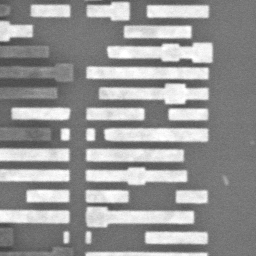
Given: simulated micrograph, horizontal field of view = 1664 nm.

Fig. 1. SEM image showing wiring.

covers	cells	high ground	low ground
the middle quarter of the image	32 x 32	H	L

HHLLLLLLLLLLLLLLLLLLLLLLLLLLLLLL
HHLLLLHHHHHHHHHHHHHHHHHHHHHHHHHH
HHLLLLHHHHHHHHHHHHHHHHHHHHHHHHHH
HHLLLLLLLLLLLLLLLLLLLLLLLLLLHHHH
LLLLLLLLLLLLLLLLLLLLLLLLLLLLLLLL
LLLLLLLLLLLLLLLLLLLLLLLLLHHHHHLL
LLLLLLLLLHHHHHHHHHHHHHHHHHHHHHHH
LLLLLLLLLHHHHHHHHHHHHHHHHHHHHHHH
LLLLLLLLLHHHHHHHHHHHHHHHHHHHHHHH
LLLLLLLLLLLLLLLLLLLLLLLLLHHHHHLL
LLLLLLLLLLLLLLLLLLLLLLLLLLLLLLLL
HLLLLLHHHHHHHHHHHHHHLLLLLLHHHHHH
HLLLLLHHHHHHHHHHHHHHLLLLLLHHHHHH
HLLLLLHHHHHHHHHHHHHHLLLLLLHHHHHH
LLLLLLLLLLLLLLLLLLLLLLLLLLLLLLLL
LLLLLLLLLLLLLLLLLLLLLLLLLLLLLLLL
HLLLLLHLLLHHHHHHHHHHHHHHHHHHHHHH
HLLLLLHLLLHHHHHHHHHHHHHHHHHHHHHH
HLLLLLHLLLHHHHHHHHHHHHHHHHHHHHHH
LLLLLLLLLLLLLLLLLLLLLLLLLLLLLLLL
LLLLLLLLLLLLLLLLLLLLLLLLLLLLLLLL
HLLLLLLLLLLLLLLLLLLLLLLLLLLLLLLL
HLLLLLHHHHHHHHHHHHHHHHHHHHHHHHLL
HLLLLLHHHHHHHHHHHHHHHHHHHHHHHHLL
LLLLLLLLLLLLLLLLLLLLLLLLLLLLLLLL
LLLLLLLLLLLLLLLLLLLLLLLLLLLLLLLL
LLLLLLLLLLLLLLLLHHHHLLLLLLLLLLLL
HLLLLLHHHHHHHHHHHHHHHHHHHHHHHHHL
HLLLLLHHHHHHHHHHHHHHHHHHHHHHHHHL
LLLLLLLLLLLLLLLLHHHHLLLLLLLLLLLL
LLLLLLLLLLLLLLLLLLLLLLLLLLLLLLLL
LLLLLLLLLLLLLLLLLLLLLLLLLLLLLLLL